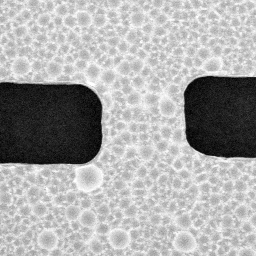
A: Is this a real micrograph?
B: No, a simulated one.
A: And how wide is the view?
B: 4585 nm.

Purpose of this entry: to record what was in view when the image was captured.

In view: holes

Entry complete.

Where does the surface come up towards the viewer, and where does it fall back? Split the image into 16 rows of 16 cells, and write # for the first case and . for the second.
################
################
################
################
################
......######....
......#####.....
......######....
......######....
......######....
################
################
################
################
################
################